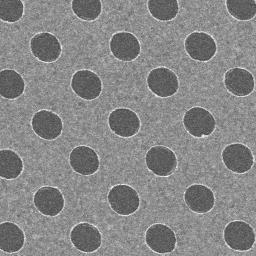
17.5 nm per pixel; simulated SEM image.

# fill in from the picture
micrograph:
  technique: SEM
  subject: a regular array of holes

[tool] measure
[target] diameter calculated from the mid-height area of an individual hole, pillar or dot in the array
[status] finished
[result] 532 nanometres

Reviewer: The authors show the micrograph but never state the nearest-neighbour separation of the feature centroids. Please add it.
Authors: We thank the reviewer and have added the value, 0.929 µm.